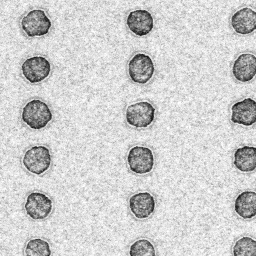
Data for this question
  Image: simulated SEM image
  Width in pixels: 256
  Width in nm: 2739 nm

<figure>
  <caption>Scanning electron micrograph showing a regular array of holes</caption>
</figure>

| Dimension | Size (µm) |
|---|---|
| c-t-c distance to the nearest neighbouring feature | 0.487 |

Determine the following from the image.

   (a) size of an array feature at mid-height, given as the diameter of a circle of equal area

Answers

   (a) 296 nm